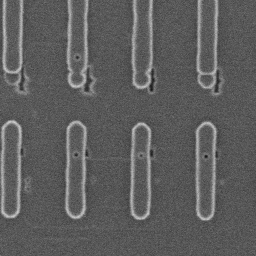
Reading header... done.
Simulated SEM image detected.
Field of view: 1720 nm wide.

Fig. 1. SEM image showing wiring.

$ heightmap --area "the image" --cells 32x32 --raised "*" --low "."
***......**......**......**.....
***......**......**......**.....
***......**......**......**.....
***......**......**......**.....
.**......**......**......**.....
.**......**......**......**.....
***......**......**......**.....
***......**......**......**.....
.**......**......**......**.....
.........**......**......**.....
.........*.......**......**.....
................................
................................
................................
................................
.*.......*.......*.......*......
***.....***......**......**.....
***.....***......**......**.....
***.....***......**......**.....
***.....***.....***......**.....
***.....***.....***......**.....
**......***.....***......**.....
***.....***.....***......**.....
**......***.....***......**.....
**......***.....***......**.....
**......***.....***......**.....
**......**......***......**.....
................................
................................
................................
................................
................................